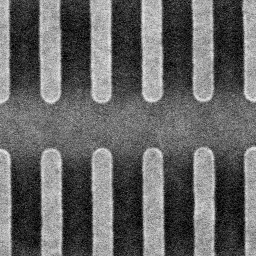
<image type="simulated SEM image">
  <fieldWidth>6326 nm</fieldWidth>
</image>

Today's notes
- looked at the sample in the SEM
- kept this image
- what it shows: groups of lines, slits or small figures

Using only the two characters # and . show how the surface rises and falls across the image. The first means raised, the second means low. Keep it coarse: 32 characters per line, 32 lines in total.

#....##....###....##....##....##
#....##....###....##....##....##
#....##.....##....##....##.....#
#....##.....##....##....##.....#
#....##.....##....##....##.....#
#....##.....##....##....###....#
#....##.....##....##....###....#
#....##.....##....##....###....#
#....##.....##....##....##.....#
#....##.....##....##....##.....#
#....##.....##....##....###....#
#....##.....##....##....###....#
#.....#.....#......#.....#.....#
................................
................................
................................
................................
................................
................................
#....##.....##....##....###....#
#....###....##....##....###....#
#....###....##....##....###....#
#....###....##....##....###....#
#....###....##....##....###....#
#....###....##....##....###....#
#....###....##....##....###....#
#....###....##....##....###....#
#....###....##....##....###....#
#....###....##....##....###....#
#....###....##....##....###....#
#....###....##....##....###....#
#....###....##....##....###....#